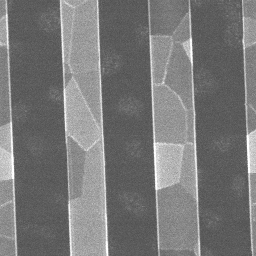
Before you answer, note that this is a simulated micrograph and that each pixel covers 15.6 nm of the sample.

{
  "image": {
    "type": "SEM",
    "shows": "one or a few lines or trenches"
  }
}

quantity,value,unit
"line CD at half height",604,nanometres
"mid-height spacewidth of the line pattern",821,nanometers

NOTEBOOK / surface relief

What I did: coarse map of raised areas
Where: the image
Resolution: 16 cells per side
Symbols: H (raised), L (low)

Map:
LLLLHHLLLHHHLLLH
LLLLHHLLLHHHLLLH
LLLLHHLLLHHHLLLH
HLLLHHLLLHHHLLLH
HLLLHHLLLHHHLLLH
HLLLHHLLLLHHLLLH
HLLLHHLLLLHHLLLH
HLLLHHLLLLHHLLLH
HLLLHHLLLLHHLLLH
HLLLHHLLLLHHLLLL
HLLLHHHLLLHHLLLL
HLLLHHHLLLHHLLLL
HLLLHHHLLLHHLLLL
HLLLHHHLLLHHLLLL
HLLLHHHLLLHHLLLL
HLLLHHHLLLHHLLLL